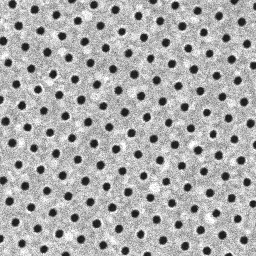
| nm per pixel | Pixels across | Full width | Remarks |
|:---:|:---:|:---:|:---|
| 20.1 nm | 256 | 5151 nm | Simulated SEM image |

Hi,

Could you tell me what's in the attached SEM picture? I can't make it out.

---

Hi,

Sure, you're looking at a regular array of holes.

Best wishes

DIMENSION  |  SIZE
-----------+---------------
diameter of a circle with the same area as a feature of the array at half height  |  0.18 microns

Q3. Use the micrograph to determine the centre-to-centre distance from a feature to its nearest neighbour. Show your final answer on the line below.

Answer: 441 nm